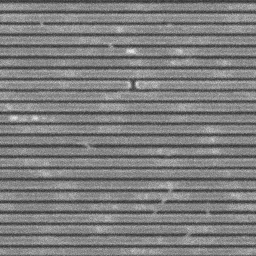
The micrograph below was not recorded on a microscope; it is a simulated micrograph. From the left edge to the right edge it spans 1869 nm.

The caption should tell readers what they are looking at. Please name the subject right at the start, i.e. parallel lines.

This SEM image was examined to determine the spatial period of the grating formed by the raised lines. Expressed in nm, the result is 81.2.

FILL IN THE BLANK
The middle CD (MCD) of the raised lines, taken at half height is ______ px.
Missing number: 6.63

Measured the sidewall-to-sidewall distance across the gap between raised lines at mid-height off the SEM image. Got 0.0274 um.